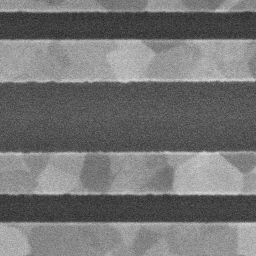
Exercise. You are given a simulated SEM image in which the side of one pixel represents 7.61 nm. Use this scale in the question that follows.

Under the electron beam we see lines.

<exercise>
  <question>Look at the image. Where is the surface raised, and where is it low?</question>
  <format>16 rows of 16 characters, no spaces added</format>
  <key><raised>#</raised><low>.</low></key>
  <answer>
################
................
................
################
################
................
................
................
................
................
################
################
................
................
################
################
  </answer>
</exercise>